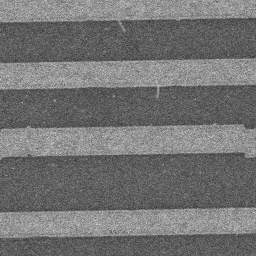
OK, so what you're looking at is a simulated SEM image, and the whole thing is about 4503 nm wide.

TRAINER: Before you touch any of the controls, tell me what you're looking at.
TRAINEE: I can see one or a few lines or trenches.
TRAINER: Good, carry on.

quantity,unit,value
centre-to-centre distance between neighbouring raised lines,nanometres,1310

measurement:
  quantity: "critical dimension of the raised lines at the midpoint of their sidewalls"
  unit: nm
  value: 435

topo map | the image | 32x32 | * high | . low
********************************
********************************
*********.......................
................................
................................
................................
................................
...............................*
********************************
********************************
******************************..
................................
................................
................................
................................
................................
********************************
********************************
********************************
*..............................*
................................
................................
................................
................................
................................
................................
............********************
********************************
********************************
*****...........................
................................
................................